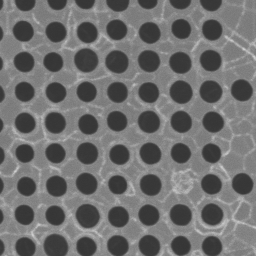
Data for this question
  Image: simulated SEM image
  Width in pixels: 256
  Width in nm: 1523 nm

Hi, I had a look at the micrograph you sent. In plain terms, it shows a regular array of holes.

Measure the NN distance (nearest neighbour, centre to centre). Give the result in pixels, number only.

30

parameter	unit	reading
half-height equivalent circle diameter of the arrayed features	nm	124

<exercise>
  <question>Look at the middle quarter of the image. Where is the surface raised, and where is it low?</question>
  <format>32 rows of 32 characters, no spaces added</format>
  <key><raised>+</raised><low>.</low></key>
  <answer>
+++.....++......+++.....+++.....
++++...++++....+++++...++++....+
++++++++++++++++++++++++++++++++
++++++++++++++++++++++++++++++++
+++++.+++++++.++++++++++++++...+
++++....+++....++++....++++.....
+++.....+++.....+++.....++......
.++.....+++.....+++.....++......
++++....+++.....+++.....+++.....
+++++..++++++.++++++...+++++...+
++++++++++++++++++++++++++++++++
++++++++++++++++++++++++++++++++
+++++++++++....++++....++++....+
++++....+++.....+++.....+++.....
++++....+++.....++......++......
++++.....++.....+++.....+++.....
++++....++++...++++....+++++...+
+++++..+++++++++++++++++++++++++
++++++++++++++++++++++++++++++++
++++++++++++++++++++++++++++++++
++++....+++++..+++++...++++....+
+++.....++++....+++.....+++.....
.++......++.....+++.....+++.....
+++.....+++.....+++.....+++.....
++++....++++....++++...+++++..++
++++++++++++++++++++++++++++++++
++++++++++++++++++++++++++++++++
++++...+++++++++++++++++++++++++
+++.....++++...++++.....++++++++
.++.....+++.....+++.....++++++++
.++.....+++.....+++.....++++++++
.+++....+++....++++.....++++++++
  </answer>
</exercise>